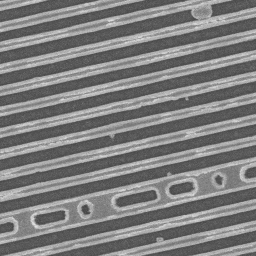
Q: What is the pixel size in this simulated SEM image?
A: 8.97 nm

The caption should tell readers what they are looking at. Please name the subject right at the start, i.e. parallel lines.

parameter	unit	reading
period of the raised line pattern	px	20.8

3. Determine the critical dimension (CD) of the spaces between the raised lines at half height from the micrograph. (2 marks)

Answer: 125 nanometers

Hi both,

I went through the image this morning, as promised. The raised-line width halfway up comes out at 6.96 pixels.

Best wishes